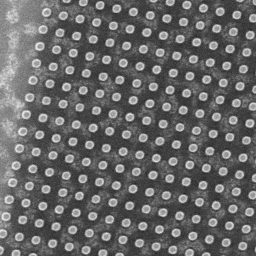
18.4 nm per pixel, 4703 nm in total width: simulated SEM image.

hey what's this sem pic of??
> a regular array of raised bodies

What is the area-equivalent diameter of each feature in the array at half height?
0.145 micrometres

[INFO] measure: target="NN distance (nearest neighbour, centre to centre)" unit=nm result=310